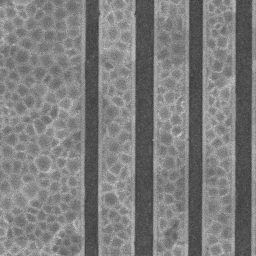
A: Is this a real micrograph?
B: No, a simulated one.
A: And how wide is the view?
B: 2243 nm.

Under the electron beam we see parallel lines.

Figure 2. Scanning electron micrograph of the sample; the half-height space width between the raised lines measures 167 nm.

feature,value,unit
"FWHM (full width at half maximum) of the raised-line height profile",278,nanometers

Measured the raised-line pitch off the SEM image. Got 0.447 µm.